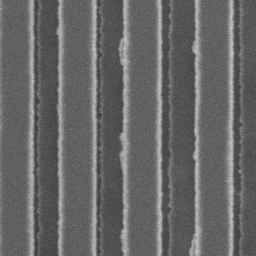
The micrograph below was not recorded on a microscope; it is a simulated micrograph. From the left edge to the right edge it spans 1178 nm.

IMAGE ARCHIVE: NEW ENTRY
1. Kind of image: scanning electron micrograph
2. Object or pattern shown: lines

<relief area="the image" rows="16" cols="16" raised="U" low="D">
UUDDUUDDUUDDUUUD
UUDDUUDDUUDDUUUD
UUDDUUDDUUDDUUUD
UUDDUUDDUUDDUUUD
UUDDUUDDUUDDUUUD
UUDDUUDDUUDDUUUD
UUDDUUDDUUDDUUUD
UUDDUUDDUUDDUUUD
UUDDUUDDUUDDUUDD
UUDDUUDDUUDDUUUD
UUDDUUDDUUDDUUDD
UUDDUUDDUUDDUUUD
UUDDUUDDUUDDUUUD
UUDDUUDDUUDDUUUD
UUDDUUDDUUDDUUUD
UUDDUUDDUUDDUUDD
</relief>